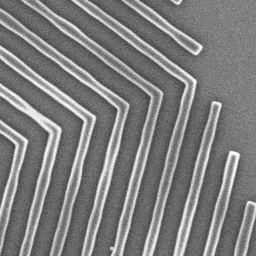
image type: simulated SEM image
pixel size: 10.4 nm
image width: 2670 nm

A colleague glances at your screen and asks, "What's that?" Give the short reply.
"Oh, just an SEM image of groups of lines, slits or small figures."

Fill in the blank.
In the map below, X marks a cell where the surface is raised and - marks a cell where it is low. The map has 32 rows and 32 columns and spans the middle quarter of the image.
XXX---------XXXX--------XXXX----
XXXXX--------XXXX---------XXX---
--XXXX--------XXXX---------XXXX-
---XXXX---------XXX----------XXX
-----XXX---------XXXX---------XX
------XXX----------XXX---------X
--------XXX---------XXXX------XX
---------XXX---------XXXX-----XX
X---------XXXX--------XX------XX
XXX---------XXXX------XX-----XXX
-XXX---------XXX-----XXX-----XXX
--XXX---------XX-----XXX-----XX-
---XXXX------XXX-----XXX-----XX-
-----XXX-----XX------XX-----XXX-
-----XX------XX-----XXX-----XXX-
-----XX------XX-----XXX-----XX--
-----XX-----XXX-----XX------XX--
-----XX-----XX------XX-----XXX--
----XX------XX------XX-----XXX--
----XX------XX-----XXX-----XX---
----XX-----XXX-----XX-----XXX---
----X------XX------XX-----XXX---
---XX------XX-----XXX-----XXX---
---XX------XX-----XXX-----XX----
---XX------XX-----XX------XX----
--XX------XX------XX-----XXX----
--XX------XX-----XXX-----XX-----
--XX------XX-----XXX-----XX-----
--XX-----XX------XX-----XXX-----
-XXX-----XX------XX-----XXX-----
-XXX-----XX------XX-----XXX-----
-XX------XX-----XX------XX-----X